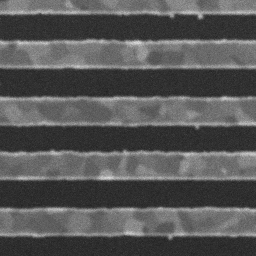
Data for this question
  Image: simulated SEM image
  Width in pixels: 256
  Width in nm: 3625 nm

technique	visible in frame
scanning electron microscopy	lines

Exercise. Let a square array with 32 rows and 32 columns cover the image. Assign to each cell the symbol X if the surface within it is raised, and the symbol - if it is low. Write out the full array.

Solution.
XXXXXXXXXXXXXXXXXXXXXXXXXXXXXXXX
XXXXXXXXXXXXXXXXXXXXXXXXXXXXXXXX
--------------------------------
--------------------------------
--------------------------------
XXXXXXXXXXXXXXXXXXXXXXXXXXXXXXXX
XXXXXXXXXXXXXXXXXXXXXXXXXXXXXXXX
XXXXXXXXXXXXXXXXXXXXXXXXXXXXXXXX
--------------------------------
--------------------------------
--------------------------------
--------------------------------
XXXXXXXXXXXXXXXXXXXXXXXXXXXXXXXX
XXXXXXXXXXXXXXXXXXXXXXXXXXXXXXXX
XXXXXXXXXXXXXXXXXXXXXXXXXXXXXXXX
XXXXX--XXXXXXXXXXX-XXXX--XXXXX--
--------------------------------
--------------------------------
--------------------------------
XXXXXXXXXXXXXXXXXXXXXXXXXXXXXXXX
XXXXXXXXXXXXXXXXXXXXXXXXXXXXXXXX
XXXXXXXXXXXXXXXXXXXXXXXXXXXXXXXX
--------------------------------
--------------------------------
--------------------------------
--------------------------------
XXXXXXXXXXXXXXXXXXXXXXXXXXXXXXXX
XXXXXXXXXXXXXXXXXXXXXXXXXXXXXXXX
XXXXXXXXXXXXXXXXXXXXXXXXXXXXXXXX
--------------------------------
--------------------------------
--------------------------------